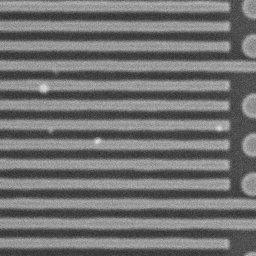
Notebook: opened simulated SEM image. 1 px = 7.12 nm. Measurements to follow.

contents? groups of lines, slits or small figures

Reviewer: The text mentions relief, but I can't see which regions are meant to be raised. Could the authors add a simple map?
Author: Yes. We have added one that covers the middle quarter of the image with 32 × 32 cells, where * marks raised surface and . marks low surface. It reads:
********************************
****.....***********************
................................
................................
********************************
********************************
...............................*
................................
................................
********************************
********************************
................................
................................
................................
********************************
********************************
................................
................................
................................
********************************
********************************
................................
................................
................................
********************************
********************************
................................
................................
................................
********************************
********************************
................................